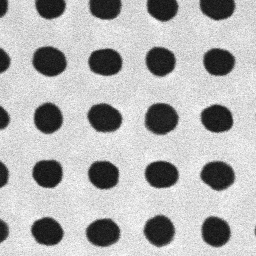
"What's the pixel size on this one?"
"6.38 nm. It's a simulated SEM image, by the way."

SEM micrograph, a regular array of holes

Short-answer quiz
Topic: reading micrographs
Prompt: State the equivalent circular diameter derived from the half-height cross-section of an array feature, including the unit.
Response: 188 nanometres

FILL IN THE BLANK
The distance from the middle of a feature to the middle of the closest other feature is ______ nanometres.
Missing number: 356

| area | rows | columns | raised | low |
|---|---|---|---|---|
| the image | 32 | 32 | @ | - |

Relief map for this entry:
-@@@@---@@@----@@@----@@@----@@@
-@@@@---@@@----@@@@---@@@----@@@
@@@@@@@@@@@@@@@@@@@@-@@@@@@@@@@@
@@@@@@@@@@@@@@@@@@@@@@@@@@@@@@@@
@@@@@@@@@@@@@@@@@@@@@@@@@@@@@@@@
@@@@@@@@@@@@@@@@@@@@@@@@@@@@@@@@
-@@@----@@@@---@@@@--@@@@@--@@@@
-@@@----@@@----@@@----@@@----@@@
-@@@----@@@----@@@@---@@@@---@@@
@@@@@@-@@@@@@@@@@@@@@@@@@@@@@@@@
@@@@@@@@@@@@@@@@@@@@@@@@@@@@@@@@
@@@@@@@@@@@@@@@@@@@@@@@@@@@@@@@@
@@@@@@@@@@@@@@@@@@@@@@@@@@@@@@@@
@@@@@--@@@@---@@@@@---@@@@--@@@@
-@@@----@@@----@@@----@@@----@@@
-@@@----@@@----@@@----@@@----@@@
@@@@@--@@@@@@@@@@@@--@@@@@@-@@@@
@@@@@@@@@@@@@@@@@@@@@@@@@@@@@@@@
@@@@@@@@@@@@@@@@@@@@@@@@@@@@@@@@
@@@@@@@@@@@@@@@@@@@@@@@@@@@@@@@@
@@@@@--@@@@@--@@@@@--@@@@@--@@@@
-@@@----@@@----@@@----@@@----@@@
-@@@----@@@----@@@----@@@----@@@
@@@@@@@@@@@@--@@@@@@@@@@@@@-@@@@
@@@@@@@@@@@@@@@@@@@@@@@@@@@@@@@@
@@@@@@@@@@@@@@@@@@@@@@@@@@@@@@@@
@@@@@@@@@@@@@@@@@@@@@@@@@@@@@@@@
@@@@@--@@@@@--@@@@@--@@@@@--@@@@
-@@@----@@@----@@@----@@@----@@@
-@@@----@@@----@@@----@@@----@@@
@@@@@--@@@@@--@@@@@--@@@@@--@@@@
@@@@@@@@@@@@@@@@@@@@@@@@@@@@@@@@